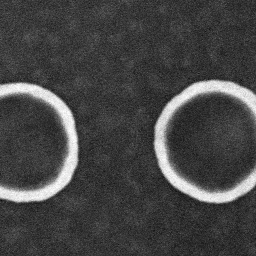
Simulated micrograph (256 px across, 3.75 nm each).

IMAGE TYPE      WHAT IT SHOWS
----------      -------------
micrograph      raised bodies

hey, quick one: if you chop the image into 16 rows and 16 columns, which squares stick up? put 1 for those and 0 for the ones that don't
0000000000000000
0000000000000000
0000000000000000
0000000000000000
0000000000000000
0000000000001100
1111000000011111
1111000000111111
1111100000111111
1111100000111111
1111000000111111
1111000000011111
0000000000000000
0000000000000000
0000000000000000
0000000000000000